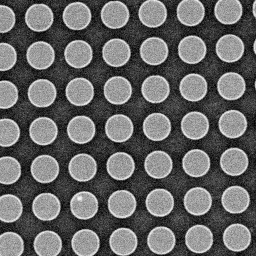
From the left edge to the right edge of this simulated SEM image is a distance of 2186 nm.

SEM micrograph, an array of small figures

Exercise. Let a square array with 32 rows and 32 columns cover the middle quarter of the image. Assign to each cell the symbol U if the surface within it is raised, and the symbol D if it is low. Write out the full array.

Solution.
DDUUUDDDDDDDUUDDDDDDDDDDDDDDDDDD
DDDDDDDDDDDDDDDDDDDDDDDDDDDDDDDD
DDDDDDDDDDDDDDDDDDDDDDDDDDDDDDDD
DDDDDDDDDDDDUUUDDDDDDUUUUDDDDDUU
DDUUUUDDDDDUUUUUDDDDUUUUUUDDDUUU
DUUUUUUDDDUUUUUUUDDDUUUUUUDDDUUU
DUUUUUUDDDUUUUUUUDDDUUUUUUDDDUUU
DUUUUUUDDDUUUUUUUDDDUUUUUUDDDUUU
DUUUUUUDDDDUUUUUDDDDUUUUUDDDDDUU
DDUUUUDDDDDDUUUDDDDDDDUUDDDDDDDD
DDDDDDDDDDDDDDDDDDDDDDDDDDDDDDDD
DDDDDDDDDDDDDDDDDDDDDDDDDDDDDDDD
DDDDDDDDDDDDDDDDDDDDDDUUDDDDDDDU
DDDUUUDDDDDDUUUUDDDDDUUUUUDDDDUU
DUUUUUUDDDDUUUUUUDDDUUUUUUDDDUUU
DUUUUUUUDDUUUUUUUDDDUUUUUUUDDUUU
DUUUUUUUDDDUUUUUUDDDUUUUUUUDDUUU
DUUUUUUUDDDUUUUUUDDDUUUUUUDDDDUU
DDUUUUUDDDDUUUUUDDDDDUUUUDDDDDDU
DDDUUUDDDDDDDDDDDDDDDDDDDDDDDDDD
DDDDDDDDDDDDDDDDDDDDDDDDDDDDDDDD
DDDDDDDDDDDDDDDDDDDDDDDDDDDDDDDD
DDDDDDDDDDDDDUUUDDDDDDUUUUDDDDDU
DDUUUUUDDDDUUUUUUDDDDUUUUUDDDDUU
DDUUUUUUDDDUUUUUUDDDUUUUUUUDDDUU
DUUUUUUUDDDUUUUUUUDDUUUUUUUDDDUU
DUUUUUUUDDDUUUUUUDDDUUUUUUUDDDUU
DDUUUUUUDDDUUUUUUDDDDUUUUUDDDDDU
DDUUUUUDDDDDUUUUDDDDDDDUDDDDDDDD
DDDDDDDDDDDDDDDDDDDDDDDDDDDDDDDD
DDDDDDDDDDDDDDDDDDDDDDDDDDDDDDDD
DDDDDDDDDDDDDDDDDDDDDDDUUDDDDDDD